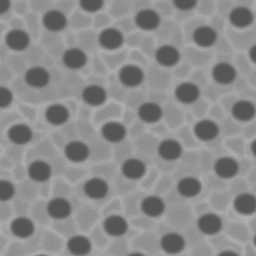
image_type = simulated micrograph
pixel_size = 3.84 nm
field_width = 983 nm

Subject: a regular array of holes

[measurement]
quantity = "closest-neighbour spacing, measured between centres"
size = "41.4 pixels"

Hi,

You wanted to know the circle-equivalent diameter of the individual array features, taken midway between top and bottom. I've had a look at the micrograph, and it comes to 84.2 nanometers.